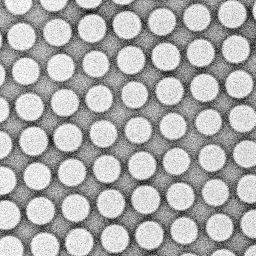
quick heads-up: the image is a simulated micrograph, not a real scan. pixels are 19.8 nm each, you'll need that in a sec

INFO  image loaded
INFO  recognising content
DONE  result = an array of small figures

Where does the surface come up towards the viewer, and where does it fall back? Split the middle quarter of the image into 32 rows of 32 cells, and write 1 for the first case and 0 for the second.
11000111111000111111000111110000
11000111111000011110000000000000
11000011110000000000000000000000
10000000000000000000000000000000
00000000000000000000000011111000
00000000000000011111000111111000
00000001111000011111000111111100
11100011111100011111100111111100
11100011111100011111100011111000
11100011111100011111000001110000
11100011111000001110000000000000
11100001110000000000000000000000
11000000000000000000000000000000
00000000000000000000000001111000
00000000011000001111100011111100
11100001111100001111100011111100
11110001111110001111110011111100
11110001111110001111110001111100
11110001111110001111100000110000
11110001111100000010000000000000
11110000011000000000000000000000
11000000000000000000000000011000
00000000000000000011100000111110
00000000011100000111110001111110
11110000111110001111111001111110
11111000111111001111111001111110
11111000111111001111111000111100
11111000111111000111110000000000
11111000111110000011100000000000
11110000000000000000000000000000
00000000000000000000000000011110
00000000000000000011111000111111